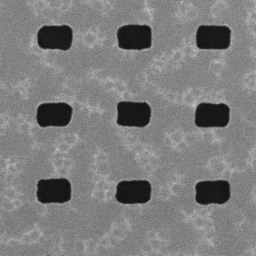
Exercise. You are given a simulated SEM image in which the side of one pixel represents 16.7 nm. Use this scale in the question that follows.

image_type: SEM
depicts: a regular array of holes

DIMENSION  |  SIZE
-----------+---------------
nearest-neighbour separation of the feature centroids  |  1.28 um